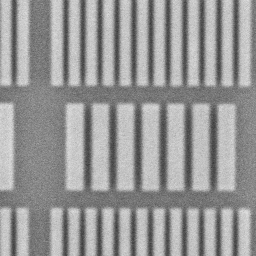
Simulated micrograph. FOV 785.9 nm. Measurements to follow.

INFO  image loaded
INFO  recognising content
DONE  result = groups of lines, slits or small figures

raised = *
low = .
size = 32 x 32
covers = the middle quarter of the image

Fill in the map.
.***..**..**..***.***.***..**..*
.***..**..**..***.***.***..**..*
.***..**..**..***.***.***..**..*
.***..**..**..***.***.***..**..*
.***..**..**..***.***.***..**..*
................................
................................
................................
................................
................................
.****..****..****...****..****..
.****..****..****...****..****..
.****..****..****...****..****..
.****..****..****...****..****..
.****..****..****...****..****..
.****..****..****...****..****..
.****..****..****...****..****..
.****..****..****...****..****..
.****..****..****...****..****..
.****..****..****...****..****..
.****..****..****...****..****..
.****..****..****...****..****..
.****..****..****...****..****..
.****..****..****...****..****..
.****..****..****...****..****..
.****..****..****...****..****..
.****..****..****...****..****..
.****..****..****...****..****..
.****..****..****...****..****..
.****..****..****...****..****..
.****..****..****...****..****..
................................